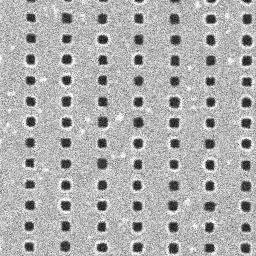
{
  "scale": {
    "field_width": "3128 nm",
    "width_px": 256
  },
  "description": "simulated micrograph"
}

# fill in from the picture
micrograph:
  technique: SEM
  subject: a regular array of holes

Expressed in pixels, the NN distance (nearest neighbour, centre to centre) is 20.6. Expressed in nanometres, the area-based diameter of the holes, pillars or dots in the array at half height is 136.